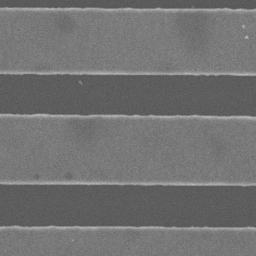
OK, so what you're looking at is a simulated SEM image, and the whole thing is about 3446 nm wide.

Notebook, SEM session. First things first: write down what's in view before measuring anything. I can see lines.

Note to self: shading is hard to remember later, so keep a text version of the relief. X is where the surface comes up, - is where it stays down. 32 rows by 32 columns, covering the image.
--------------------------------
XXXXXXXXXXXXXXXXXXXXXXXXXXXXXXXX
XXXXXXXXXXXXXXXXXXXXXXXXXXXXXXXX
XXXXXXXXXXXXXXXXXXXXXXXXXXXXXXXX
XXXXXXXXXXXXXXXXXXXXXXXXXXXXXXXX
XXXXXXXXXXXXXXXXXXXXXXXXXXXXXXXX
XXXXXXXXXXXXXXXXXXXXXXXXXXXXXXXX
XXXXXXXXXXXXXXXXXXXXXXXXXXXXXXXX
XXXXXXXXXXXXXXXXXXXXXXXXXXXXXXXX
--------------------------------
--------------------------------
--------------------------------
--------------------------------
--------------------------------
XXXXXXXXXX-XXXXXXXX---XXX-------
XXXXXXXXXXXXXXXXXXXXXXXXXXXXXXXX
XXXXXXXXXXXXXXXXXXXXXXXXXXXXXXXX
XXXXXXXXXXXXXXXXXXXXXXXXXXXXXXXX
XXXXXXXXXXXXXXXXXXXXXXXXXXXXXXXX
XXXXXXXXXXXXXXXXXXXXXXXXXXXXXXXX
XXXXXXXXXXXXXXXXXXXXXXXXXXXXXXXX
XXXXXXXXXXXXXXXXXXXXXXXXXXXXXXXX
XXXXXXXXXXXXXXXXXXXXXXXXXXXXXXXX
--------------------------------
--------------------------------
--------------------------------
--------------------------------
--------------------------------
XXXXXXXXXXXXXXXXXXXXXXXXXXXXXXXX
XXXXXXXXXXXXXXXXXXXXXXXXXXXXXXXX
XXXXXXXXXXXXXXXXXXXXXXXXXXXXXXXX
XXXXXXXXXXXXXXXXXXXXXXXXXXXXXXXX